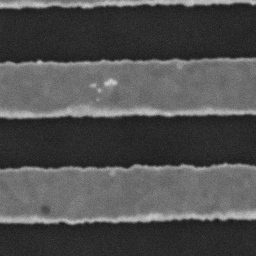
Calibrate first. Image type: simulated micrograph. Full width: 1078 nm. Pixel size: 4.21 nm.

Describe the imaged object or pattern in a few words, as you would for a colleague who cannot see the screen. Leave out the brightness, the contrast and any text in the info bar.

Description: lines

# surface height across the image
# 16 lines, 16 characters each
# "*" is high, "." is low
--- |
................
................
................
................
****************
****************
****************
................
................
................
.*..**.*********
****************
****************
****************
................
................